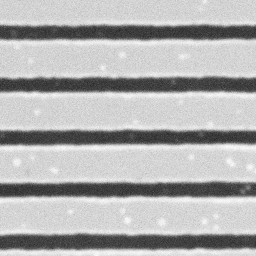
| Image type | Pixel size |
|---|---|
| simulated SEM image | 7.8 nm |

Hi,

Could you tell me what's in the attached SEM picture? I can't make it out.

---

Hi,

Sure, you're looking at lines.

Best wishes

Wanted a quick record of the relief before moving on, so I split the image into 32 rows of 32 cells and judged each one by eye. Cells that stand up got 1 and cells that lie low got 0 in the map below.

11111111111111111111111111111111
11111111111111111111111111111111
11111111111111111111111111111111
00000000000000000000000000000000
00000000000000000000000000000000
11111111111111111111111111111111
11111111111111111111111111111111
11111111111111111111111111111111
11111111111111111111111111111111
11111111111111111111111111011111
00000000000000000000000000000000
00000000000000000000000000000000
11111111111111111111111111111111
11111111111111111111111111111111
11111111111111111111111111111111
11111111111111111111111111111111
00000000000000000000000000000000
00000000000000000000000000000000
11111111111111111111111111111111
11111111111111111111111111111111
11111111111111111111111111111111
11111111111111111111111111111111
11111111111111111111111111111111
00000000000000000000000000000000
00000000000000000000000000000000
11111111111111111111111111111111
11111111111111111111111111111111
11111111111111111111111111111111
11111111111111111111111111111111
00000000000000000000000000000000
00000000000000000000000000000000
11111111111111111111111111111111